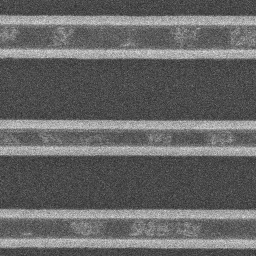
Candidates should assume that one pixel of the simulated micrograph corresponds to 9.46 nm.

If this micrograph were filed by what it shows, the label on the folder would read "one or a few lines or trenches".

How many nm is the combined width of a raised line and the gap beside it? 906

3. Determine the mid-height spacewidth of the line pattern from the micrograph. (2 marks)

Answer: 622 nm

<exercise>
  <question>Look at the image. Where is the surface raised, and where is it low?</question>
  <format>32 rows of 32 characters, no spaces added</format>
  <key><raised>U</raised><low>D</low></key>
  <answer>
DDDDDDDDDDDDDDDDDDDDDDDDDDDDDDDD
DDDDDDDDDDDDDDDDDDDDDDDDDDDDDDDD
DDDDDDDDDDDDDDDDDDDDDDDUDDDDDDUU
UUUUUUUUUUUUUUUUUUUUUUUUUUUUUUUU
UUUUUUUUUUUUUUUUUUUUUUUUUUUUUUUU
UUUUUUUUUUUUUUUUUUUUUUUUUUUUUUUU
UUUUUUUUUUUUUUUUUUUUUUUUUUUUUUUU
DDDDDDDDDDDDDDDDDDDDDDDDDDDDDDDD
DDDDDDDDDDDDDDDDDDDDDDDDDDDDDDDD
DDDDDDDDDDDDDDDDDDDDDDDDDDDDDDDD
DDDDDDDDDDDDDDDDDDDDDDDDDDDDDDDD
DDDDDDDDDDDDDDDDDDDDDDDDDDDDDDDD
DDDDDDDDDDDDDDDDDDDDDDDDDDDDDDDD
DDDDDDDDDDDDDDDDDDDDDDDDDDDDDDDD
DDDDDDDDDDDDDDDDDDDDDDDDDDDDDDDD
DDDDDDDDDDDDDDDDDDDDDDDDDDDDDDDD
UUUUUUUUUUUUUUUUUUUUUUUUUUUUUUUU
UUUUUUUUUUUUUUUUUUUUUUUUUUUUUUUU
UUUUUUUUUUUUUUUUUUUUUUUUUUUUUUUU
DDDDDDDDDDDDDDDDDDDDDDDDDDDDDDDD
DDDDDDDDDDDDDDDDDDDDDDDDDDDDDDDD
DDDDDDDDDDDDDDDDDDDDDDDDDDDDDDDD
DDDDDDDDDDDDDDDDDDDDDDDDDDDDDDDD
DDDDDDDDDDDDDDDDDDDDDDDDDDDDDDDD
DDDDDDDDDDDDDDDDDDDDDDDDDDDDDDDD
DDDDDDDDDDDDDDDDDDDDDDDDDDDDDDDD
DDDDDDDDDDDDDDDDDDDDDDDDDDDDDDDD
UUUUUUUUUUUUUUUUUUUUUUUUUUUUUUUU
UUUUUUUUUUUUUUUUUUUUUUUUUUUUUUUU
UUUUUUUUUUUUUUUUUUUUUUUUUUUUUUUU
DDDDDDDDDDDDDDDDDDDDUUUUDDDDDDDD
DDDDDDDDDDDDDDDDDDDDDDDDDDDDDDDD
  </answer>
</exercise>